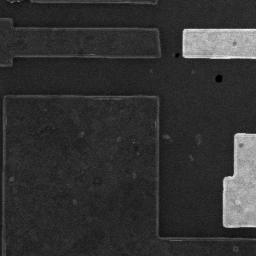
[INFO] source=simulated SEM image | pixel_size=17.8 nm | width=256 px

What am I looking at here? wiring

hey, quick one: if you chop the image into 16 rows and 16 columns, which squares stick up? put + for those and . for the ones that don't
................
+...............
++++++++++.+++++
++++++++++..++++
................
................
++++++++++......
++++++++++......
++++++++++.....+
++++++++++.....+
++++++++++.....+
++++++++++....++
++++++++++....++
++++++++++....++
++++++++++......
++++++++++++++++